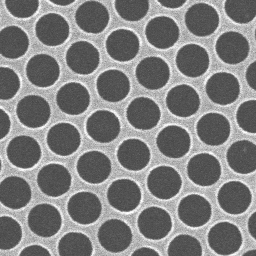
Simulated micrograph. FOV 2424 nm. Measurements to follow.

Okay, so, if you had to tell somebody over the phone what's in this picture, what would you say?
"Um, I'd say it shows a regular array of holes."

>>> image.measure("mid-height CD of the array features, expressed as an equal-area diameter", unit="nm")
325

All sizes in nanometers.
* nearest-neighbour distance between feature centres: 391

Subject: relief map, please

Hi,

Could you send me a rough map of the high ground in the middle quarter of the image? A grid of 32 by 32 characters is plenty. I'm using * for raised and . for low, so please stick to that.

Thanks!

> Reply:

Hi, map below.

*........*********........**....
**......***..*****.........**...
***...***......***.........***..
********........**........******
**.*****.........**.......******
.....***.........**......***....
......**........******.***......
......**........**********......
.......**......***...****.......
.......****..****......**.......
......**********........**......
.....****..****.........**......
*...***......**.........***.....
******........**........********
******........**........********
...**.........***......***...***
....**........*****..***......**
....**........*********........*
....***......**********.........
....****....***.....***.........
....**********.......**.........
...**********.........**.......*
..***.....***.........***......*
****.......**.........*****..***
***.........**.......**********.
***.........**.......***..*****.
.**.........****...***......***.
..*.........*********........**.
..**.......**********........**.
..****....**......***........***
..*********........**........***
.**********........**........***